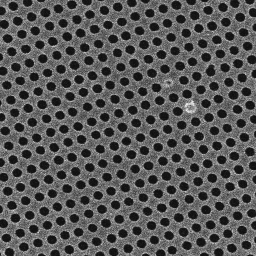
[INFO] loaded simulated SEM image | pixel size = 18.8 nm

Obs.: a regular array of holes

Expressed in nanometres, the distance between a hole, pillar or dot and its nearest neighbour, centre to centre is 258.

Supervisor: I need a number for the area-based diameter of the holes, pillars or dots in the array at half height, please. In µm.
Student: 0.178